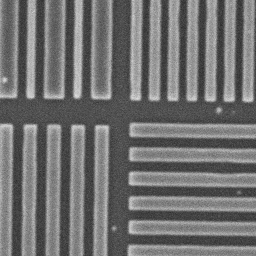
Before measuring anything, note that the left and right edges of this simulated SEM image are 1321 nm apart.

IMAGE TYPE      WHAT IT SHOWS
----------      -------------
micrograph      groups of lines, slits or small figures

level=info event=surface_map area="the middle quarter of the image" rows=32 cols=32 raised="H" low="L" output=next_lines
LLLHLLLHHHHHLLLLLHHLLLHHLLHHLLLH
LLLHLLLHHHHHLLLLLHHLLLHHLLHHLLLH
LLLHLLLHHHHHLLLLLHHLLLHHLLHHLLLH
LLLHLLLHHHHHLLLLLHHLLLHHLLHHLLLH
LLLHLLLHHHHHLLLLLHHLLLHHLLHHLLLH
LLLHLLLHHHHHLLLLLHHLLLHHLLHHLLLH
LLLHLLLHHHHHLLLLLHHLLLHHLLHHLLLH
LLLHLLLHHHHHLLLLLHHLLLHHLLHHLLLH
LLLLLLLHHHHHLLLLLHHLLLHHLLHHLLLH
LLLLLLLLLLLLLLLLLLLLLLLLLLLLLLLL
LLLLLLLLLLLLLLLLLLLLLLLLLLLLLLLL
LLLLLLLLLLLLLLLLLLLLLLLLLLLLLLLL
LLLLLLLLLLLLLLLLLLLLLLLLLLLLLLLL
LLLLLLLLLLLLLLLLLLLLLLLLLLLLLLLL
LLLLLLLLLLLLLLLLLLLLLLLLLLLLLLLL
LLHHHLLLHHHLLLLLLHHHHHHHHHHHHHHH
LLHHHLLLHHHLLLLLLHHHHHHHHHHHHHHH
LLHHHLLLHHHLLLLLLHHHHHHHHHHHHHHH
LLHHHLLLHHHLLLLLLLLLLLLLLLLLLLLL
LLHHHLLLHHHLLLLLLLLLLLLLLLLLLLLL
LLHHHLLLHHHLLLLLLLLLLLLLLLLLLLLL
LLHHHLLLHHHLLLLLLHHHHHHHHHHHHHHH
LLHHHLLLHHHLLLLLLHHHHHHHHHHHHHHH
LLHHHLLLHHHLLLLLLHHHHHHHHHHHHHHH
LLHHHLLLHHHLLLLLLLLLLLLLLLLLLLLL
LLHHHLLLHHHLLLLLLLLLLLLLLLLLLLLL
LLHHHLLLHHHLLLLLLLLLLLLLLLLLLLLL
LLHHHLLLHHHLLLLLLHHHHHHHHHHHHHHH
LLHHHLLLHHHLLLLLLHHHHHHHHHHHHHHH
LLHHHLLLHHHLLLLLLHHHHHHHHHHHHHHH
LLHHHLLLHHHLLLLLLLLLLLLLLLLLLLLL
LLHHHLLLHHHLLLLLLLLLLLLLLLLLLLLL